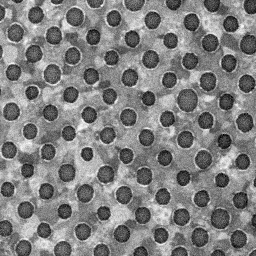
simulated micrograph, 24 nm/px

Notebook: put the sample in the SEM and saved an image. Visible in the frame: a regular array of holes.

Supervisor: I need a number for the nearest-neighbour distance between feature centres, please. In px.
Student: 27.3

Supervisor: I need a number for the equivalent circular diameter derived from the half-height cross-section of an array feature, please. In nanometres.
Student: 418